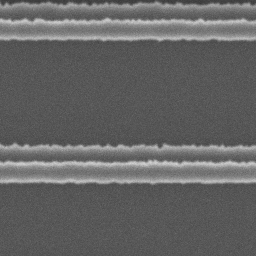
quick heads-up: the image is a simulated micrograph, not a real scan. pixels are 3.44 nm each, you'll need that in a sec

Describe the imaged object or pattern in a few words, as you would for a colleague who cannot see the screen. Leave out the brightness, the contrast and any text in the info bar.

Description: lines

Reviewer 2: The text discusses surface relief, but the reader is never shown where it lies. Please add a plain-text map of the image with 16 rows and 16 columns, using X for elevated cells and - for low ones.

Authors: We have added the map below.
XXXXXXXXXXXXXXXX
XXXXXXXXXXXXXXXX
----------------
----------------
----------------
----------------
----------------
----------------
----------------
XXXXXXXXXXXXXXXX
XXXXXXXXXXXXXXXX
----------------
----------------
----------------
----------------
----------------